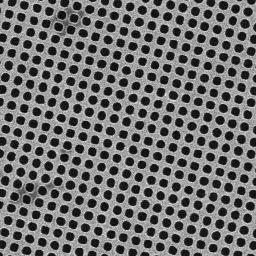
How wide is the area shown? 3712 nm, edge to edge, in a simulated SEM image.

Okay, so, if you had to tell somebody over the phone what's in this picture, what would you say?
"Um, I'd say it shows a regular array of holes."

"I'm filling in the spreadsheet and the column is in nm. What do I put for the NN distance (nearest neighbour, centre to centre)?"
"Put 179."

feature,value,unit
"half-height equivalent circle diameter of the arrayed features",0.133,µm